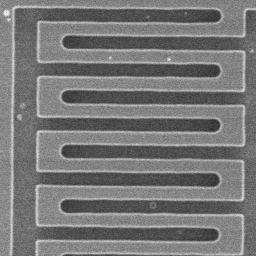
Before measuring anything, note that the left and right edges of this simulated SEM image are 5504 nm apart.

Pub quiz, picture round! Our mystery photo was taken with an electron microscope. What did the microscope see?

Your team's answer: groups of lines, slits or small figures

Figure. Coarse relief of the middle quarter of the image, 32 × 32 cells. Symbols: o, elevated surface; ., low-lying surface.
................................
................................
................................
ooooooooooooooooooooooooooooo...
oooooooooooooooooooooooooooooooo
oooooooooooooooooooooooooooooooo
o........ooooooooooooooooooooooo
................................
................................
................................
oooooooooooooooooooooooooooooooo
oooooooooooooooooooooooooooooooo
oooooooooooooooooooooooooooooooo
................................
................................
................................
................................
oooooooooooooooooooooooooooooooo
oooooooooooooooooooooooooooooooo
oooooooooooooooooooooooooooooooo
................................
................................
................................
................................
oooooooooooooooooooooooooooooooo
oooooooooooooooooooooooooooooooo
oooooooooooooooooooooooooooooooo
................................
................................
................................
................................
oooooooooooooooooooooooooooooooo